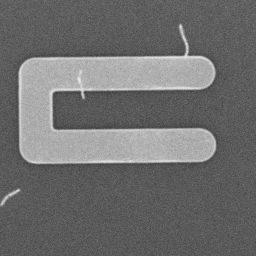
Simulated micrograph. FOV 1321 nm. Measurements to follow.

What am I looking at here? groups of lines, slits or small figures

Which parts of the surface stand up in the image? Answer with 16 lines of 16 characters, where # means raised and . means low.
................
................
................
................
.############...
.############...
.##.............
.##.............
.############...
.############...
................
................
................
................
................
................